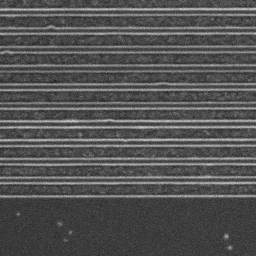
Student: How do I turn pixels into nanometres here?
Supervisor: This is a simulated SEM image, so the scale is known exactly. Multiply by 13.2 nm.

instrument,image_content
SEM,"parallel lines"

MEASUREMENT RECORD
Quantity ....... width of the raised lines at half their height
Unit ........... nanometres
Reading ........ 82.3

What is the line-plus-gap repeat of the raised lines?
246 nm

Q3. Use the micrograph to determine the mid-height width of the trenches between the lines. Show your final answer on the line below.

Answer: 0.165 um